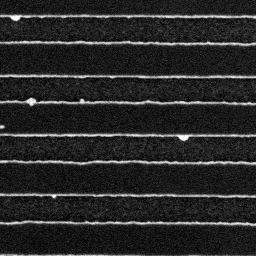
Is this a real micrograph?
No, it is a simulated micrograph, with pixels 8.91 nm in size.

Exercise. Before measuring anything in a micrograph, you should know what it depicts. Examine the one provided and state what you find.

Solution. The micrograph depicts lines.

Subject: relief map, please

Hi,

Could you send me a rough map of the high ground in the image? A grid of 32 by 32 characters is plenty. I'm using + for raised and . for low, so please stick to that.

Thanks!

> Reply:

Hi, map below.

++++++++++++++++++++++++++++++++
++++++++++++++++++++++++++++++++
................................
................................
................................
++++++++++++++++++++++++++++++.+
++++++++++++++++++++++++++++++++
++++++++++++++++++++++++++++++++
++++++++++++++++++++++++++++++++
++++++++++++++++++++++++++++++++
................................
................................
................................
++++++++++++++++++++++++++++++++
++++++++++++++++++++++++++++++++
++++++++++++++++++++++++++++++++
++++++++++++++++++++++++++++++++
................................
................................
................................
++++++++++++++++++++++++++++++++
++++++++++++++++++++++++++++++++
++++++++++++++++++++++++++++++++
++++++++++++++++++++++++++++++++
...........................+++++
................................
................................
................................
++++++++++++++++++++++++++++++++
++++++++++++++++++++++++++++++++
++++++++++++++++++++++++++++++++
++++++++++++++++++++++++++++++++